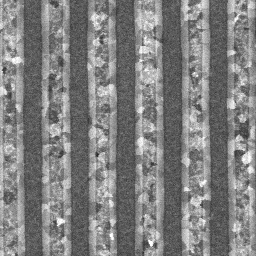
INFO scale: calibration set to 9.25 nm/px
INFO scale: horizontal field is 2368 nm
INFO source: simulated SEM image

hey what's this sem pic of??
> parallel lines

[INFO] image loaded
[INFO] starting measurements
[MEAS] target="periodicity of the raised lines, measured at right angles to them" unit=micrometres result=0.429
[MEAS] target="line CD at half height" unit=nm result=207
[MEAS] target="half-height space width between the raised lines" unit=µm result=0.216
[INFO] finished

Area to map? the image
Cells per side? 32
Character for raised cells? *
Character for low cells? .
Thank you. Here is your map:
***...**...***...***...***...***
***...**...***...***...***...***
***...**...***...***...***...***
***...**...***...***...***...***
***...**...***...***...***...**.
***...**...***...***...***...***
***...**...***...***...***...***
***...**...***...***...***...***
***...**...***...***...***...***
***...**...***...***...***...***
***...**...***...***...***...***
***...**...***...***...***...***
***...**...***...***...***...***
***...**....**...***...***...***
***...**....**...***...***...***
***...**....**...***...***...***
***...**....**...***...***...***
***...**....**...***...***...***
***...**....**...***...***...***
***...**....**...***...***...***
***...***...**...***...***...***
***...***..***...***...***...***
***...***..***...***...***...***
***...**...***...***...***...***
***...**...***...***...***...***
***...**...***...***...***...***
***...**...***...***...***...***
***...**...***...***...***...***
***...**...***...***...***...***
***...***..***...***...***...***
***...***..***...***...***...***
***...***..***...***...***...***